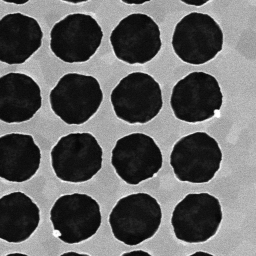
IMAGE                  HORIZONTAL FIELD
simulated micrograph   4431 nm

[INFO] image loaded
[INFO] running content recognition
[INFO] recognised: a regular array of holes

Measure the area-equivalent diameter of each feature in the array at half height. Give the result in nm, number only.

879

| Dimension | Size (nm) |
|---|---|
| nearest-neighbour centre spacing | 1030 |